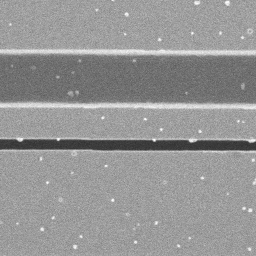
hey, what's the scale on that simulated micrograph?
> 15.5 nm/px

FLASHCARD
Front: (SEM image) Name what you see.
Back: lines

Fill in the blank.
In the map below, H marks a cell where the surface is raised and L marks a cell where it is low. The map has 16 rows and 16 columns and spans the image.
HHHHHHHHHHHHHHHH
HHHHHHHHHHHHHHHH
HHHHHHHHHHHHHHHH
LLLLLLLLLLLLLLLL
LLLLLLLLLLLLLLLL
LLLLLLLLLLLLLLLL
LLLLLLLLLLLLLLLL
HHHHHHHHHHHHHHHH
HHHHHHHHHHHHHHHH
HHHHHHHHHHHHHHHH
HHHHHHHHHHHHHHHH
HHHHHHHHHHHHHHHH
HHHHHHHHHHHHHHHH
HHHHHHHHHHHHHHHH
HHHHHHHHHHHHHHHH
HHHHHHHHHHHHHHHH